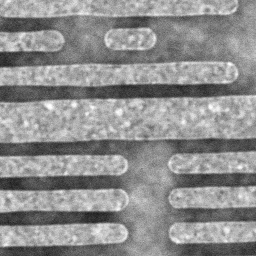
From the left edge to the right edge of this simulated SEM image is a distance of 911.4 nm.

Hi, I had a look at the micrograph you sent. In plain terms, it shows groups of lines, slits or small figures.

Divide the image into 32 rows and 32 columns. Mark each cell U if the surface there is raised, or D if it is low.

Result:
UUUUUUUUUUUUUUUUUUUUUUUUUUUUUUDD
UUUUUUUUUUUUUUUUUUUUUUUUUUUUUDDD
DDDDDDDDDDDDDDDDDDDDDDDDDDDDDDDD
DDDDDDDDDDDDDDDDDDDDDDDDDDDDDDDD
UUUUUUUUDDDDDUUUUUUDDDDDDDDDDDDD
UUUUUUUUDDDDDUUUUUUDDDDDDDDDDDDD
DDDDDDDDDDDDDDDDDDDDDDDDDDDDDDDD
DDDDDDDDDDDDDDDDDDDDDDDDDDDDDDDD
DUUUUUUUUUUUUUUUUUUUUUUUUUUUUUDD
UUUUUUUUUUUUUUUUUUUUUUUUUUUUUUDD
UUUUUUUUUUUUUUUDDDDDDDDDDDDDDDDD
DDDDDDDDDDDDDDDDDDDDDDDDDDDDDDDD
DDDDDDDDDDDUUDUUUUUUUUUUUUUUUUUU
UUUUUUUUUUUUUUUUUUUUUUUUUUUUUUUU
UUUUUUUUUUUUUUUUUUUUUUUUUUUUUUUU
UUUUUUUUUUUUUUUUUUUUUUUUUUUUUUUU
UUUUUUUUUUUUUUUUUUUUUUUUUUUUUUUU
UUUUUUUUUUUDDDDDDDDDDDDDDDDDDDDD
DDDDDDDDDDDDDDDDDDDDDDDDDDDDDDDD
DDDDDUUUUUUUUUUDDDDDDDUUUUUUUUUU
UUUUUUUUUUUUUUUUDDDDDUUUUUUUUUUU
UUUUUUUUUUUUUUUDDDDDDDUUUUUUDDDD
DDDDDDDDDDDDDDDDDDDDDDDDDDDDDDDD
DDDDDDDDDDDDDDDDDDDDDDDDDUUUUUUU
UUUUUUUUUUUUUUUUDDDDDUUUUUUUUUUU
UUUUUUUUUUUUUUUUDDDDDDUUUUUUUUUU
DDDDDDDDDDDDDDDDDDDDDDDDDDDDDDDD
DDDDDDDDDDDDDDDDDDDDDDDDDDDDDDDD
UUUUUUUUUUUUUUUDDDDDDUUUUUUUUUUU
UUUUUUUUUUUUUUUUDDDDDUUUUUUUUUUU
UUUUUUUUUUUDDDDDDDDDDDDDDDDDDDDD
DDDDDDDDDDDDDDDDDDDDDDDDDDDDDDDD